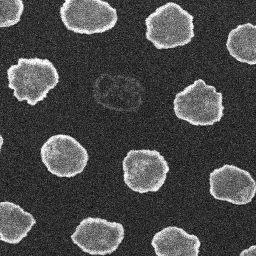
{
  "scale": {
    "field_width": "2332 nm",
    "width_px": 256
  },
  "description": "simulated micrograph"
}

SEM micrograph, raised bodies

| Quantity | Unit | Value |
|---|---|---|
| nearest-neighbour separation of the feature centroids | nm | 746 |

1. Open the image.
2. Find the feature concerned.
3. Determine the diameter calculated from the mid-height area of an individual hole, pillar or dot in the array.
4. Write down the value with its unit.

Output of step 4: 407 nanometers